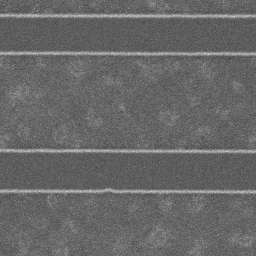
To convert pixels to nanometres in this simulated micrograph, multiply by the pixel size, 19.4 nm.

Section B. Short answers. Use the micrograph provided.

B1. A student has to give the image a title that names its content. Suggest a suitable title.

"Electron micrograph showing one or a few lines or trenches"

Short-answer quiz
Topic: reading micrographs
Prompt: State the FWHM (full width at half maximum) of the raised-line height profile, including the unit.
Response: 751 nm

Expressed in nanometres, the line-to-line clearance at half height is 1880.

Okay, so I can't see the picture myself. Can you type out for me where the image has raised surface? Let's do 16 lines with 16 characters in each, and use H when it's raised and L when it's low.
LLLLLLLLLLLLLLLL
HHHHHHHHHHHHHHHH
HHHHHHHHHHHHHHHH
LLLLLLLLLLLLLLLL
LLLLLLLLLLLLLLLL
LLLLLLLLLLLLLLLL
LLLLLLLLLLLLLLLL
LLLLLLLLLLLLLLLL
LLLLLLLLLLLLLLLL
HHHHHHHHHHHHHHHH
HHHHHHHHHHHHHHHH
HHHHHHHHHHHHHHHH
LLLLLLLLLLLLLLLL
LLLLLLLLLLLLLLLL
LLLLLLLLLLLLLLLL
LLLLLLLLLLLLLLLL